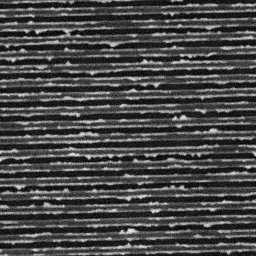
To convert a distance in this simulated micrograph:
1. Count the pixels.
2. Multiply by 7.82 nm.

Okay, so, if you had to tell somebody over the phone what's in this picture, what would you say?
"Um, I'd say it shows parallel lines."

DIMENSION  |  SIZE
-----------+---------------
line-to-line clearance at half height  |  47.9 nanometers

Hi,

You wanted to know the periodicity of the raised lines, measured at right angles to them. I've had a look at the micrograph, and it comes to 110 nm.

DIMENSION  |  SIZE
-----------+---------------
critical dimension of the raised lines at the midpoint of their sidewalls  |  62.6 nanometers